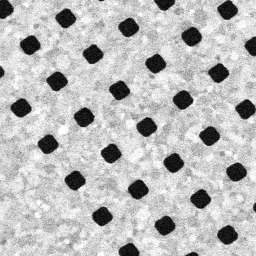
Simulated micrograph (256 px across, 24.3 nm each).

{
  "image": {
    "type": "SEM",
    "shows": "a regular array of holes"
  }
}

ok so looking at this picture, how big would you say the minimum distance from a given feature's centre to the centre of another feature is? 1090 nanometers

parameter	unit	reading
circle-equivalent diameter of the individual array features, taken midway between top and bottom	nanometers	476